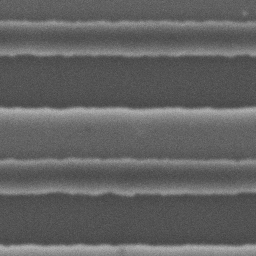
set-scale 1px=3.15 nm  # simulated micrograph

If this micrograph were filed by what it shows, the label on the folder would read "lines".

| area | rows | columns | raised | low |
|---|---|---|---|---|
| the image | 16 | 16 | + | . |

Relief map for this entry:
++++++++++++++++
++++++++++++++++
++++++++++++++++
................
................
................
................
++++++++++++++++
++++++++++++++++
++++++++++++++++
++++++++++++++++
++++++++++++++++
................
................
................
++++++++++++++++